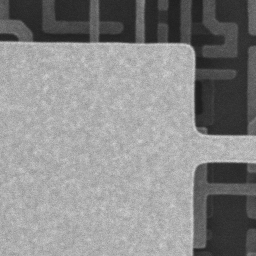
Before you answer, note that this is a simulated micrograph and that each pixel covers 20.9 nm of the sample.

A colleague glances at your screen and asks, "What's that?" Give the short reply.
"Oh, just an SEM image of wiring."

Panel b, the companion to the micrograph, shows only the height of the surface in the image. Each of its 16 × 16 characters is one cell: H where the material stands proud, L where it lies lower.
LLLLLLLLLLLLLLLL
LLLLLLLLLLLLLLLL
LLLLLLLLLLLLLLLL
HHHHHHHHHHHHLLLL
HHHHHHHHHHHHLLLL
HHHHHHHHHHHHLLLL
HHHHHHHHHHHHLLLL
HHHHHHHHHHHHLLLL
HHHHHHHHHHHHHHHH
HHHHHHHHHHHHHHHH
HHHHHHHHHHHHLLLL
HHHHHHHHHHHHLLLL
HHHHHHHHHHHHLLLL
HHHHHHHHHHHHLLLL
HHHHHHHHHHHHLLLL
HHHHHHHHHHHHLLLL